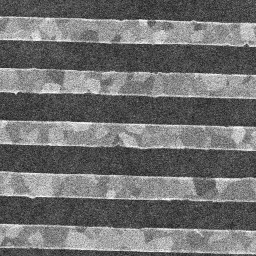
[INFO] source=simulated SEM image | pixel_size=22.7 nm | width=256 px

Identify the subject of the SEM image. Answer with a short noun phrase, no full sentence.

parallel lines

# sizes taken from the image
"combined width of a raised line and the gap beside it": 1180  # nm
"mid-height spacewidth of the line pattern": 676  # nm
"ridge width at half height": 0.494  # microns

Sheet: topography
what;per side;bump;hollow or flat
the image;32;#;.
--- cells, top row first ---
................................
................................
###########.....................
################################
################################
...................#........####
................................
................................
................................
##############################..
################################
....##..########################
................................
................................
................................
##############..................
################################
################################
.........................#######
................................
................................
................................
################################
################################
....############################
................................
................................
................................
###########.....................
################################
################################
..........................######